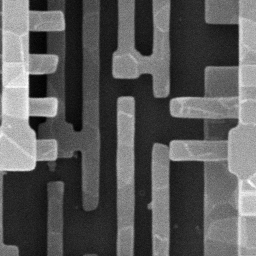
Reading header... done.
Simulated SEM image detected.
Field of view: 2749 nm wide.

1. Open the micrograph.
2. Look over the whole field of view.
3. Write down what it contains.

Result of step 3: wiring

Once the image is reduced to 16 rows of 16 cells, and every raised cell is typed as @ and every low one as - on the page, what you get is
@@-------------@
@@-------------@
@@-------------@
@@-------------@
@@-------------@
@@-------------@
@@-------------@
@@-------------@
@@------------@@
@@------------@@
@@------------@@
---------------@
---------------@
---------------@
---------------@
---------------@